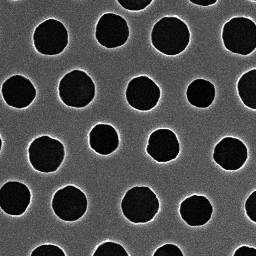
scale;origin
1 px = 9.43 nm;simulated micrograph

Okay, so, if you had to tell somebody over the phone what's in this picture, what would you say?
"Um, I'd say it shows a regular array of holes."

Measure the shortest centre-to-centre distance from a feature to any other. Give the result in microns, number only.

0.535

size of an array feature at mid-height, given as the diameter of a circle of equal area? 323 nanometers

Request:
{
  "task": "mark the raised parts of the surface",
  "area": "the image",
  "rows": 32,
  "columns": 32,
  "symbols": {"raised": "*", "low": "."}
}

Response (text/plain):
***************....*****...*****
********************************
******.*****....****...******..*
*****...****....***....*****....
****....****....***.....****....
****....*****..****....*****....
*****...************...******..*
********************************
********************************
********...*******************..
....***.....****...*****..****..
....***.....****....***....***..
*...****....****....****...***..
**.**************..************.
********************************
********************************
***********....****...**********
****...****....****...******..**
****....***....***....*****....*
****....***********...*****....*
****....*******************...**
*****.**************************
********************************
...*****..*******..*************
....***....****....*****.******.
....**.....****.....***...*****.
*..****....****.....***...*****.
********..******...****...*****.
********************************
********************************
*************..*****************
****....****....***....******...